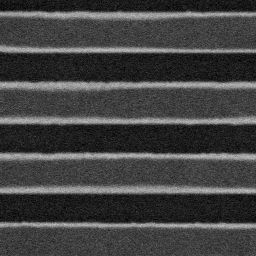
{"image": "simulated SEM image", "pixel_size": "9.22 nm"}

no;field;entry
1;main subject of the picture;lines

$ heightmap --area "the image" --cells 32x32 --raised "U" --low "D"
DDDDDDDDDDDDDDDDDDDDDDDDDDDDDDDD
DDDDDDDDDDDDDDDDDDDDDDDDDDDDDDDD
UUUUUUUUUUUUUUUUUUUUUUUUUUUUUUUU
UUUUUUUUUUUUUUUUUUUUUUUUUUUUUUUU
UUUUUUUUUUUUUUUUUUUUUUUUUUUUUUUU
UUUUUUUUUUUUUUUUUUUUUUUUUUUUUUUU
DDDDDDDDDDDDDDDDDDDDDDUUUDUUUUUU
DDDDDDDDDDDDDDDDDDDDDDDDDDDDDDDD
DDDDDDDDDDDDDDDDDDDDDDDDDDDDDDDD
DDDDDDDDDDDDDDDDDDDDDDDDDDDDDDDD
DUUDDDDDDDDDDDDDDDDDDDDDUUDDDUDD
UUUUUUUUUUUUUUUUUUUUUUUUUUUUUUUU
UUUUUUUUUUUUUUUUUUUUUUUUUUUUUUUU
UUUUUUUUUUUUUUUUUUUUUUUUUUUUUUUU
UUUUUUUUUUUUUUUUUUUUUUUUUUUUUUUU
DDDDDDDDDDDDDDDDDDDDDDDDDDDDDDDD
DDDDDDDDDDDDDDDDDDDDDDDDDDDDDDDD
DDDDDDDDDDDDDDDDDDDDDDDDDDDDDDDD
DDDDDDDDDDDDDDDDDDDDDDDDDDDDDDDD
UUUUUUUUUUUUUUUUUUUUUUUUUUUUUUUU
UUUUUUUUUUUUUUUUUUUUUUUUUUUUUUUU
UUUUUUUUUUUUUUUUUUUUUUUUUUUUUUUU
UUUUUUUUUUUUUUUUUUUUUUUUUUUUUUUU
UUUUUUUUUUUUUUUUUUUUUUUUUUUUUUUU
DDDDDDDDDDDDDDDDDDDDDDDDDDDDDDDD
DDDDDDDDDDDDDDDDDDDDDDDDDDDDDDDD
DDDDDDDDDDDDDDDDDDDDDDDDDDDDDDDD
DDDDDDDDDDDDDDDDDDDDDDDDDDDDDDDD
UUUUUUUUUUUUUUUUUUUUUUUUUUUUUUUU
UUUUUUUUUUUUUUUUUUUUUUUUUUUUUUUU
UUUUUUUUUUUUUUUUUUUUUUUUUUUUUUUU
UUUUUUUUUUUUUUUUUUUUUUUUUUUUUUUU